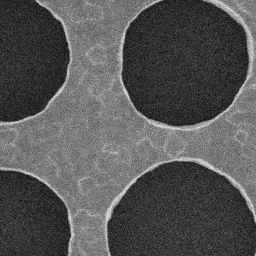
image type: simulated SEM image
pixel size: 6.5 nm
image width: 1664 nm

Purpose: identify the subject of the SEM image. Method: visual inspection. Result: holes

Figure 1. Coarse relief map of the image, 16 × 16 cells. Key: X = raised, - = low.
---XXXXXX-----XX
----XXXX-------X
----XXXX--------
----XXXX--------
----XXXX--------
----XXXX-------X
---XXXXX------XX
-XXXXXXXX----XXX
XXXXXXXXXXXXXXXX
XXXXXXXXXXXXXXXX
XXXXXXXXXX---XXX
---XXXXX-------X
----XXX--------X
----XXX---------
----XXX---------
----XXX---------